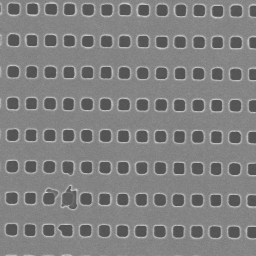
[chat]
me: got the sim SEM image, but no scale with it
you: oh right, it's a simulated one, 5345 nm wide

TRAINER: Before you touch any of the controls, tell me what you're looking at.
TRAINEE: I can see a regular array of holes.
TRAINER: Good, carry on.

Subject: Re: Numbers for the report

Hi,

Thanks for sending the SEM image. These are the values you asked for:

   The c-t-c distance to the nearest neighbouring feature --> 0.386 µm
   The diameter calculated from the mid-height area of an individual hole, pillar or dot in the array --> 262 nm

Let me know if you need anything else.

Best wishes